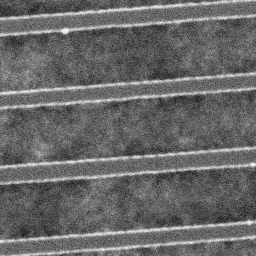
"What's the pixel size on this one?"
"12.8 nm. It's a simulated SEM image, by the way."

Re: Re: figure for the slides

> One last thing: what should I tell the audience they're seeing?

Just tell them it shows lines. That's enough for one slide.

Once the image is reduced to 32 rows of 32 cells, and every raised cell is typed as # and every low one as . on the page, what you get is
.........................#######
...........#####################
#########################.......
############....................
................................
................................
................................
................................
................................
............................####
..............##################
...#########################....
##############..................
#...............................
................................
................................
................................
................................
...............................#
..................##############
.....###########################
####################............
#######.........................
................................
................................
................................
................................
................................
......................##########
.........#######################
#####################...........
#########.......................